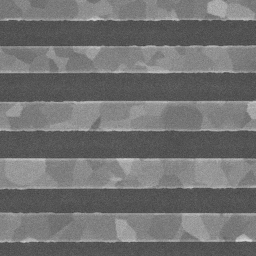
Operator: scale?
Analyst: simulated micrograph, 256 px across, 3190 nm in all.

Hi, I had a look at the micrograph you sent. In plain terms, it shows lines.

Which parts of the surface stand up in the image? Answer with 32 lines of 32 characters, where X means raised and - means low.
XXXXXXXXXXXXXXXXXXXXXXXXXXXXXXXX
XXXXXXXXXXXXXXXXXXXXXXXXXXXXXXXX
X-XXXXXXXXXX-XXX-XXX----X-------
--------------------------------
--------------------------------
--------------------------------
XXXXXXXXXXXXXXXXXXXXXXXXXXXXXXXX
XXXXXXXXXXXXXXXXXXXXXXXXXXXXXXXX
XXXXXXXXXXXXXXXXXXXXXXXXXXXXXXXX
--------------------------------
--------------------------------
--------------------------------
--------------------------------
XXXXXXXXXXXXXXXXXXXXXXXXXXXXXXXX
XXXXXXXXXXXXXXXXXXXXXXXXXXXXXXXX
XXXXXXXXXXXXXXXXXXXXXXXXXXXXXXXX
--------------------------------
--------------------------------
--------------------------------
--------------------------------
XXXXXXXXXXXXXXXXXXXXXXXXXXXXXXXX
XXXXXXXXXXXXXXXXXXXXXXXXXXXXXXXX
XXXXXXXXXXXXXXXXXXXXXXXXXXXXXXXX
XXXXXXXXXXXXX-XXXXXX-XXX--X-----
--------------------------------
--------------------------------
--------------------------------
XXXXXXXXXXXXXXXXXXXXXXXXXXXXXXXX
XXXXXXXXXXXXXXXXXXXXXXXXXXXXXXXX
XXXXXXXXXXXXXXXXXXXXXXXXXXXXXXXX
--------------------------------
--------------------------------